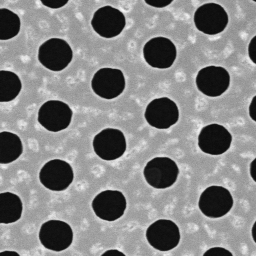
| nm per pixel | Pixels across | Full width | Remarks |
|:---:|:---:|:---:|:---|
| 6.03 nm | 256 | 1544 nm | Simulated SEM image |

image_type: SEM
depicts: a regular array of holes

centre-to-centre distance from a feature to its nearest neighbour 360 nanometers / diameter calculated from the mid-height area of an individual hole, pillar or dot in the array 0.196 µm